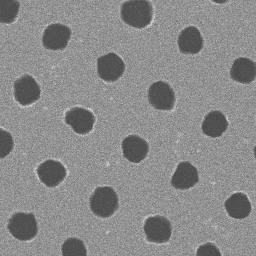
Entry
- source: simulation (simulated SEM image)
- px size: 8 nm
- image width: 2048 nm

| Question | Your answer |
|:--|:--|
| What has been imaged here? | a regular array of holes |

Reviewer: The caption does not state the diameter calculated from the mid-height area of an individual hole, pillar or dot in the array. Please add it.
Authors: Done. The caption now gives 212 nanometres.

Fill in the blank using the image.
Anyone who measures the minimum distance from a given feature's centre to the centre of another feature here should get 59.7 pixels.